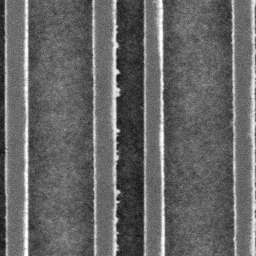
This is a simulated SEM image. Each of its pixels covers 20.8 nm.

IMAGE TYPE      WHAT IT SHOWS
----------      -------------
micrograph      lines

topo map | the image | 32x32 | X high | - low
-XX---------XX----XX---------XXX
-XX---------XX----XX---------XXX
-XX---------XX----XX---------XXX
-XX---------XX----XX---------XXX
-XX---------XX----XX---------XXX
-XX---------XX----XX---------XXX
-XX---------XX----XX---------XXX
-XX---------XX----XX---------XXX
-XX---------XX----XX---------XXX
-XX---------XX----XX---------XXX
-XX---------XX----XX---------XXX
-XX---------XX----XX---------XXX
-XX---------XX----XX---------XXX
-XX---------XX----XX---------XXX
-XX---------XX----XX---------XXX
-XX---------XX----XX---------XXX
-XX---------XX----XX---------XXX
-XX---------XX----XX---------XXX
-XX---------XX----XX---------XXX
-XX---------XX----XX---------XXX
-XX---------XX----XX---------XXX
-XX---------XX----XX---------XXX
-XX---------XX----XX---------XXX
-XX---------XX----XX---------XXX
-XX---------XX----XX---------XXX
-XX---------XXX---XX---------XXX
-XX---------XX----XX---------XXX
-XX---------XX----XX---------XXX
-XX---------XX----XX---------XXX
-XX---------XX----XX---------XXX
-XX---------XX----XX---------XXX
-XX---------XX----XX---------XXX